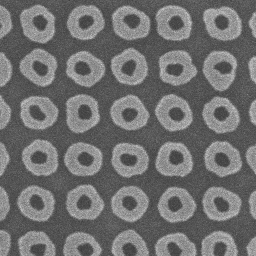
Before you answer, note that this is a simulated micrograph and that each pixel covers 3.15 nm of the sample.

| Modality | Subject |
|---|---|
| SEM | a regular array of ring-shaped raised bodies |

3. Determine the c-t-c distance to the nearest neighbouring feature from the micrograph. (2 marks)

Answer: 0.136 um